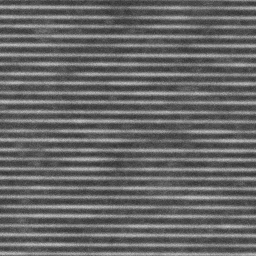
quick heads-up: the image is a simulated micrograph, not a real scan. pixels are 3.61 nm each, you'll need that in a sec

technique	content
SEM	parallel lines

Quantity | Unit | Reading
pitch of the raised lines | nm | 34.2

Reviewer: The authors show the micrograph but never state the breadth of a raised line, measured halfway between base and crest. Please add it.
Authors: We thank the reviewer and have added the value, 0.0063 microns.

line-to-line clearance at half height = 0.0275 µm